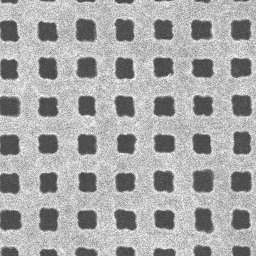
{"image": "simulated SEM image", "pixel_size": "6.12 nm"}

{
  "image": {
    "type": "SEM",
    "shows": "a regular array of holes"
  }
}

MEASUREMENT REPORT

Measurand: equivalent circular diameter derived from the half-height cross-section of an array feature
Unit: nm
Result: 127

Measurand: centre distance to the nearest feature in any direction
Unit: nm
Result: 229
